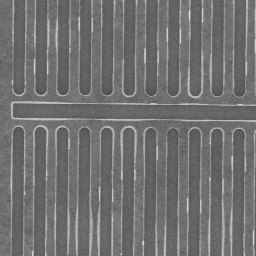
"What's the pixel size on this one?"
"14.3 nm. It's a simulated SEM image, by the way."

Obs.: groups of lines, slits or small figures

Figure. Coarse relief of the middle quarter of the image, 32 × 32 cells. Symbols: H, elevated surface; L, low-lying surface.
LHHHLLLHHLLLHHHLLLHHLLLLHHLLLHHL
LHHHLLLHHLLLHHHLLLHHLLLLHHLLLHHL
LHHHLLLHHLLLHHHLLLHHLLLLHHLLLHHL
LHHHLLLHHLLLHHHLLLHHLLLLHHLLLHHL
LHHHLLLHHLLLHHHLLLHHLLLLHHLLLHHL
LHHHLLLHHLLLHHHLLLHHLLLLHHLLLHHL
LHHHLLLHHLLLHHHLLLHHLLLHHHLLLHHL
LHHHLLHHHHLLHHHLLHHHHLLHHHLLLHHL
HHHHHHHHHHHHHHHHHHHHHHHHHHHHHHHH
HHHHHHHHHHHHHHHHHHHHHHHHHHHHHHHH
LLLLLLLLLLLLLLLLLLLLLLLLLLLLLLLL
LLLLLLLLLLLLLLLLLLLLLLLLLLLLLLLL
LLLLLLLLLLLLLLLLLLLLLLLLLLLLLLLL
LLLLLLLLLLLLLLLLLLLLLLLLLLLLLLLL
HHHHHHHHHHHHHHHHHHHHHHHHHHHHHHHH
HHHHHHHHHHHHHHHHHHHHHHHHHHHHHHHH
LHHHLLHHHLLLHHHLLLHHHLLHHHLLHHHH
LHHHLLLHHLLLHHLLLLHHLLLHHHLLLHHL
LHHHLLLHHLLLHHLLLLHHLLLHHHLLLHHL
LHHHLLLHHLLLHHLLLLHHLLLHHHLLLHHL
LHHHLLLHHLLLHHLLLLHHLLLHHHLLLHHL
LHHHLLLHHLLLHHLLLLHHLLLHHHLLLHHL
LHHHLLLHHLLLHHLLLLHHLLLHHHLLLHHL
LHHHLLLHHLLLHHLLLLHHLLLHHHLLLHHL
LHHHLLLHHLLLHHLLLLHHLLLHHHLLLHHL
LHHHLLLHHLLLHHLLLLHHLLLHHHLLLHHL
LHHHLLLHHLLLHHLLLLHHLLLHHHLLLHHL
LHHHLLLHHLLLHHLLLLHHLLLHHHLLLHHL
LHHHLLLHHLLLHHLLLLHHLLLHHHLLLHHL
LHHLLLLHHLLLHHLLLLHHLLLHHHLLLHHL
LHHLLLLHHLLLHHLLLLHHLLLHHHLLLHHL
LHHLLLLHHLLLHHLLLLHHLLLHHLLLLHHL